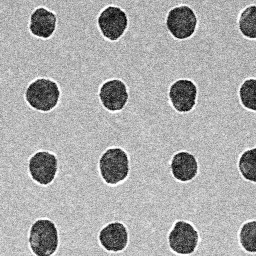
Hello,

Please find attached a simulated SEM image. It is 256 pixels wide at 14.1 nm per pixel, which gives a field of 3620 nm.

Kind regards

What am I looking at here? a regular array of holes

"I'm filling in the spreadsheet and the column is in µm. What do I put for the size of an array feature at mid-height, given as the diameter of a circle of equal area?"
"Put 0.442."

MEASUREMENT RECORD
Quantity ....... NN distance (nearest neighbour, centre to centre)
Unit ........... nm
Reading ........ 984